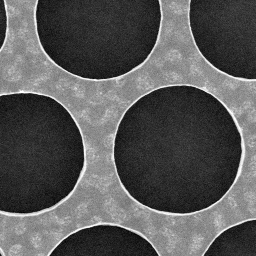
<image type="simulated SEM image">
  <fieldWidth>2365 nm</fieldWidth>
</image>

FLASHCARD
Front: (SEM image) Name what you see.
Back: holes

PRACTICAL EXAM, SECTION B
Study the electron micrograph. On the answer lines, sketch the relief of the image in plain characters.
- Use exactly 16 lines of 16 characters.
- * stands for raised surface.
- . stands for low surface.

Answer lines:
**........**....
**........**....
**........**....
***......****...
****....******..
**********..****
....****......**
.....***.......*
.....**........*
.....**........*
.....**........*
.....***.......*
....*****.....**
****************
*****...******..
***.......***...